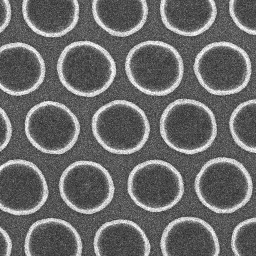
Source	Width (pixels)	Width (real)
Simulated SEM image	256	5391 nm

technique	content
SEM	a regular array of raised bodies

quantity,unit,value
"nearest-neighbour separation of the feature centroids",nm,1430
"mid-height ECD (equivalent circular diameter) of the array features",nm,1100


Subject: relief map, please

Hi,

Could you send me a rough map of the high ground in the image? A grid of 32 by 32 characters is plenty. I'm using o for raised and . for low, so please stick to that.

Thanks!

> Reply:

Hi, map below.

o..ooooooo..oooooo..ooooooo..ooo
o..ooooooo..oooooo..ooooooo..ooo
o..oooooo...oooooo...ooooo...ooo
....ooooo....oooo....ooooo....oo
................................
..........o.......oo............
oooo....ooooo...oooooo...ooooo..
ooooo...oooooo..oooooo...oooooo.
ooooo..ooooooo..ooooooo..oooooo.
ooooo...oooooo..ooooooo..oooooo.
ooooo...oooooo...ooooo...oooooo.
.oo......ooo.......oo......oo...
................................
....oooo.....oooo....ooooo....oo
o...ooooo...oooooo...oooooo..ooo
o..ooooooo..oooooo..ooooooo..ooo
o..ooooooo..oooooo..ooooooo..ooo
o...ooooo...oooooo...ooooo....oo
.....ooo.....oooo.....ooo......o
................................
.ooo.....ooo......ooo.....oooo..
ooooo...ooooo....ooooo...oooooo.
ooooo...oooooo..ooooooo..oooooo.
oooooo..oooooo..ooooooo..oooooo.
oooooo..oooooo...ooooo...oooooo.
ooooo....oooo....ooooo....oooo..
.ooo............................
......o................oo.......
....ooooo....oooo....ooooo....oo
o..ooooooo..oooooo...oooooo..ooo
o..ooooooo..oooooo..ooooooo..ooo
o...oooooo..oooooo...oooooo..ooo